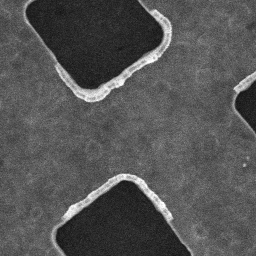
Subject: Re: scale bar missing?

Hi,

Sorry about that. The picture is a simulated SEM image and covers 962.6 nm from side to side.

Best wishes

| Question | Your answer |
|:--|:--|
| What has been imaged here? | holes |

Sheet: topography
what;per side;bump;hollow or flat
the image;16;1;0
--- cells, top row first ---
1100000001111111
1100000000111111
1110000000111111
1110000001111111
1111000011111111
1111101111111110
1111111111111110
1111111111111110
1111111111111111
1111111111111111
1111111111111111
1111111011111111
1111110001111111
1111100000111111
1111000000011111
1111000000001111